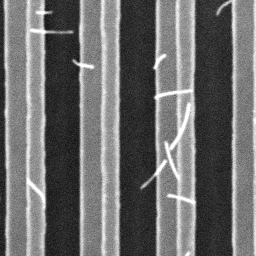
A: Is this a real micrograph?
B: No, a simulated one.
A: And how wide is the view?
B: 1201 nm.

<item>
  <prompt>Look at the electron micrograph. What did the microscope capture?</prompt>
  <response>lines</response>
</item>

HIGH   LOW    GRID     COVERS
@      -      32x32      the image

-@@@@-----@@@@@-----@@@@-----@@@
-@@@@@----@@@@@-----@@@@-----@@@
-@@@@-----@@@@@-----@@@@-----@@@
-@@@@@----@@@@@-----@@@@-----@@@
-@@@@@----@@@@@-----@@@@-----@@@
-@@@@-----@@@@@-----@@@@-----@@@
-@@@@-----@@@@@-----@@@@-----@@@
-@@@@-----@@@@@-----@@@@-----@@@
-@@@@-----@@@@@----@@@@@-----@@@
-@@@@-----@@@@@-----@@@@-----@@@
-@@@@-----@@@@@-----@@@@-----@@@
-@@@@-----@@@@@-----@@@@-----@@@
-@@@@-----@@@@@-----@@@@-----@@@
-@@@@-----@@@@@-----@@@@-----@@@
-@@@@@----@@@@@-----@@@@-----@@@
-@@@@@----@@@@@-----@@@@-----@@@
-@@@@-----@@@@@-----@@@@-----@@@
-@@@@-----@@@@@-----@@@@-----@@@
-@@@@-----@@@@@-----@@@@-----@@@
-@@@@-----@@@@@-----@@@@-----@@@
-@@@@-----@@@@@-----@@@@-----@@@
-@@@@@----@@@@@-----@@@@-----@@@
-@@@@-----@@@@@-----@@@@-----@@@
-@@@@@----@@@@@-----@@@@-----@@@
-@@@@@----@@@@@-----@@@@-----@@@
-@@@@@----@@@@@-----@@@@-----@@@
-@@@@@----@@@@@-----@@@@-----@@@
-@@@@@----@@@@@-----@@@@-----@@@
-@@@@@----@@@@@-----@@@@-----@@@
-@@@@@----@@@@@-----@@@@-----@@@
-@@@@-----@@@@@-----@@@@-----@@@
-@@@@-----@@@@@-----@@@@-----@@@